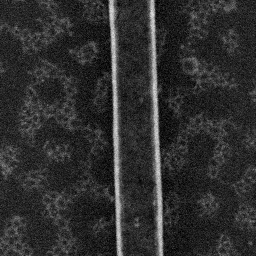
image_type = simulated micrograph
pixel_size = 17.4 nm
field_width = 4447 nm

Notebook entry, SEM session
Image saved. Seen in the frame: one or a few lines or trenches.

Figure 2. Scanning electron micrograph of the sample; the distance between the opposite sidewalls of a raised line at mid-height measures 726 nm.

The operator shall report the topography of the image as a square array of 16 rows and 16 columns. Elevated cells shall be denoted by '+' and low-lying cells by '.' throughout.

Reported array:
.......+++......
.......+++......
.......+++......
.......+++......
.......+++......
.......+++......
.......+++......
.......+++......
.......+++......
.......+++......
.......+++......
.......+++......
.......+++......
.......+++......
.......+++......
.......+++......